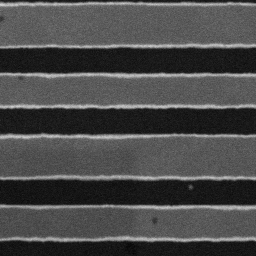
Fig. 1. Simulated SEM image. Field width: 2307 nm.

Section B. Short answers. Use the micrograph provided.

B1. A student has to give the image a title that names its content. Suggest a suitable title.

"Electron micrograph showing lines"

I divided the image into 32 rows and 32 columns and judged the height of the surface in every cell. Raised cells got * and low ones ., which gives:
*.*****************.*.***...***.
********************************
********************************
********************************
********************************
********************************
................................
................................
................................
********************************
********************************
********************************
********************************
*****...*.*.*****..**...******.*
................................
................................
................................
********************************
********************************
********************************
********************************
********************************
................................
................................
................................
................................
********************************
********************************
********************************
********************************
................................
................................